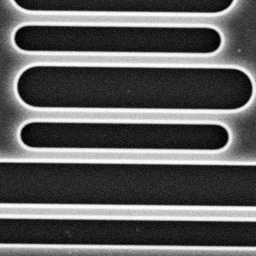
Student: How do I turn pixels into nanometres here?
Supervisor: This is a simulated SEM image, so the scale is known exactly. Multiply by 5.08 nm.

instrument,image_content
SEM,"groups of lines, slits or small figures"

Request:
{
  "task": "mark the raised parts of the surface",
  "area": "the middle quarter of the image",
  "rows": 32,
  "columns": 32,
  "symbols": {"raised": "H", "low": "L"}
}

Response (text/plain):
LLLLLLLLLLLLLLLLLLLLLLLLLLLLLLHH
LLLLLLLLLLLLLLLLLLLLLLLLLLLLLLLL
LLLLLLLLLLLLLLLLLLLLLLLLLLLLLLLL
LLLLLLLLLLLLLLLLLLLLLLLLLLLLLLLL
LLLLLLLLLLLLLLLLLLLLLLLLLLLLLLLL
LLLLLLLLLLLLLLLLLLLLLLLLLLLLLLLL
LLLLLLLLLLLLLLLLLLLLLLLLLLLLLLLL
LLLLLLLLLLLLLLLLLLLLLLLLLLLLLLLL
LLLLLLLLLLLLLLLLLLLLLLLLLLLLLLLL
LLLLLLLLLLLLLLLLLLLLLLLLLLLLLLLL
LLLLLLLLLLLLLLLLLLLLLLLLLLLLLLLL
HHHHHHHHHHHHLLLLLLLLLLLLLLLLLLLL
HHHHHHHHHHHHHHHHHHHHHHHHHHHHHHHH
HHHHHHHHHHHHHHHHHHHHHHHHHHHHHHHH
LLLLLLLLLLLLLLLLLLLLLLLLLLLLLLLL
LLLLLLLLLLLLLLLLLLLLLLLLLLLLLLLL
LLLLLLLLLLLLLLLLLLLLLLLLLLLLLLLL
LLLLLLLLLLLLLLLLLLLLLLLLLLLLLLLL
LLLLLLLLLLLLLLLLLLLLLLLLLLLLLLLL
LLLLLLLLLLLLLLLLLLLLLLLLLLLLLLLL
LLLLLLLLLLLLLLLLLLLLLLLLLLLLLLLL
LLLLLLLLLLLLLLLLLLLLLLLLLLLLLLLL
HHHHHHHHHHHHHHHHHHHHHHHHHHHHHHHH
HHHHHHHHHHHHHHHHHHHHHHHHHHHHHHHH
LLLLLLLLLLLLLLLLLLHHHHHHHHHHHHHH
LLLLLLLLLLLLLLLLLLLLLLLLLLLLLLLL
LLLLLLLLLLLLLLLLLLLLLLLLLLLLLLLL
LLLLLLLLLLLLLLLLLLLLLLLLLLLLLLLL
LLLLLLLLLLLLLLLLLLLLLLLLLLLLLLLL
LLLLLLLLLLLLLLLLLLLLLLLLLLLLLLLL
LLLLLLLLLLLLLLLLLLLLLLLLLLLLLLLL
LLLLLLLLLLLLLLLLLLLLLLLLLLLLLLLL